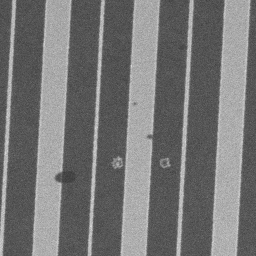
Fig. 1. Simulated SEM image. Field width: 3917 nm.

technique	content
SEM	lines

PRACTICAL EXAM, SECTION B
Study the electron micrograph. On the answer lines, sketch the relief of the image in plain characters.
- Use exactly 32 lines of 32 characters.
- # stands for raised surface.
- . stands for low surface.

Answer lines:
......###........###........###.
......###........###........###.
......###........###........###.
......###........###........###.
......###........###........###.
.....####........###........###.
.....###........####........###.
.....###........####........###.
.....###........###.........###.
.....###........###.........###.
.....###........###.........###.
.....###........###.........###.
.....###........###.........###.
.....###........###........####.
.....###........###........###..
.....###........###........###..
.....###........###........###..
.....###........###........###..
.....###........###........###..
.....###........###........###..
.....###......#####.#......###..
.....###........###........###..
.....###........###........###..
.....###........###........###..
....####........###........###..
....###........####........###..
....###........####........###..
....###........###.........###..
....###........###.........###..
....###........###.........###..
....###........###.........###..
....###........###........####..